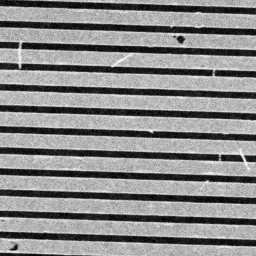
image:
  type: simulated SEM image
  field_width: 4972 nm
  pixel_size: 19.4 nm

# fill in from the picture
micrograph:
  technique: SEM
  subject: parallel lines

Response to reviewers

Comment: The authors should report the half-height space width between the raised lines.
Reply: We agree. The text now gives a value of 155 nanometres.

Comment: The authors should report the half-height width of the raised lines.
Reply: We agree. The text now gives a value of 0.255 µm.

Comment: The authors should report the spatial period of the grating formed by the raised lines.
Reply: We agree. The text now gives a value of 409 nm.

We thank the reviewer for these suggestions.